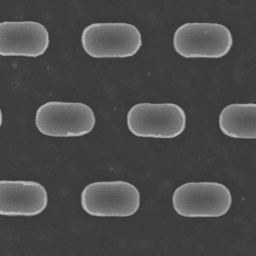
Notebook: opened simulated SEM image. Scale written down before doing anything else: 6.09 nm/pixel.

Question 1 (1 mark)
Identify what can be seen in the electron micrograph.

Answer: raised bodies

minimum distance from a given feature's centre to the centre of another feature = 556 nm